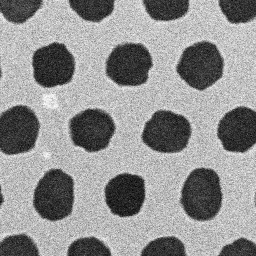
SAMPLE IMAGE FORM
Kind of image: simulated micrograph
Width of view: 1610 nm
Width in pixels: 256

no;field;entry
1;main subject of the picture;a regular array of holes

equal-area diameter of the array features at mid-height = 287 nm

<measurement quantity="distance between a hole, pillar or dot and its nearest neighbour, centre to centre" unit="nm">450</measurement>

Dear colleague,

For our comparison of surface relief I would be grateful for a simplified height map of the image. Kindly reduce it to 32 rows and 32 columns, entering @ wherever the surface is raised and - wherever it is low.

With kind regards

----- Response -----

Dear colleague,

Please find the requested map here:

-----@@@@-----@@@@------@@@-----
-----@@@@-----@@@@-----@@@@@----
@--@@@@@@@@--@@@@@@---@@@@@@---@
@@@@@@@@@@@@@@@@@@@@@@@@@@@@@@@@
@@@@@@@@@@@@@@@@@@@@@@@@@@@@@@@@
@@@@@@--@@@@@@@--@@@@@@@---@@@@@
@@@@-----@@@@@-----@@@@----@@@@@
@@@@-----@@@@------@@@------@@@@
@@@@-----@@@@------@@@------@@@@
@@@@-----@@@@------@@@------@@@@
@@@@@---@@@@@@@---@@@@@----@@@@@
@@@@@@@@@@@@@@@@@@@@@@@@@@@@@@@@
@@@@@@@@@@@@@@@@@@@@@@@@@@@@@@@@
@---@@@@@@@@@@@@@@@@@@@@@@@@@--@
-----@@@@-----@@@@@----@@@@@----
-----@@@@-----@@@@------@@@-----
-----@@@@-----@@@@------@@@-----
-----@@@@-----@@@@------@@@-----
----@@@@@@---@@@@@@----@@@@@---@
@@@@@@@@@@@@@@@@@@@@@@@@@@@@@@@@
@@@@@@@@@@@@@@@@@@@@@@@@@@@@@@@@
@@@@@@--@@@@@@@@@@@@@@@@---@@@@@
@@@@@----@@@@@----@@@@@----@@@@@
@@@@-----@@@@-----@@@@@-----@@@@
@@@@-----@@@@-----@@@@@-----@@@@
@@@@-----@@@@-----@@@@@-----@@@@
@@@@@----@@@@@---@@@@@@----@@@@@
@@@@@@-@@@@@@@@@@@@@@@@@--@@@@@@
@@@@@@@@@@@@@@@@@@@@@@@@@@@@@@@@
@--@@@@@@@@@@@@@@@@@@@@@@@@@@@@@
----@@@@@----@@@@@-----@@@@@@---
-----@@@------@@@@-----@@@@-----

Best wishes